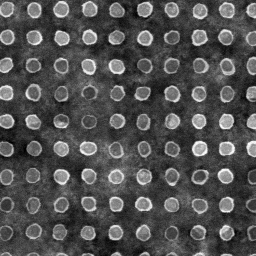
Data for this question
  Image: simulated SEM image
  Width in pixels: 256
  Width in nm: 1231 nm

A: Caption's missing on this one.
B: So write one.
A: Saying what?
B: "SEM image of a regular array of raised bodies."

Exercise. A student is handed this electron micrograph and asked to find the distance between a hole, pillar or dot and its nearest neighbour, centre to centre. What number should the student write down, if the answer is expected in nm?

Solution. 130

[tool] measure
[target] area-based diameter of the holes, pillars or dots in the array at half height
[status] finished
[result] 69.1 nanometers